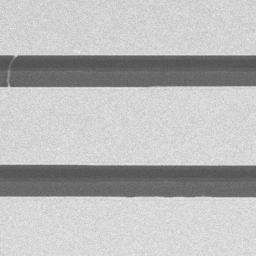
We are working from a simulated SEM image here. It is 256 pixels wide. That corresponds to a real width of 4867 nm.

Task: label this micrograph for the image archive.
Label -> lines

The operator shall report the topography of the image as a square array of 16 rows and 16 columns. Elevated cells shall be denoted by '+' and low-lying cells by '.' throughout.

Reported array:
++++++++++++++++
++++++++++++++++
++++++++++++++++
................
................
++++++++++++++++
++++++++++++++++
++++++++++++++++
++++++++++++++++
++++++++++++++++
................
................
++++++++++++++++
++++++++++++++++
++++++++++++++++
++++++++++++++++